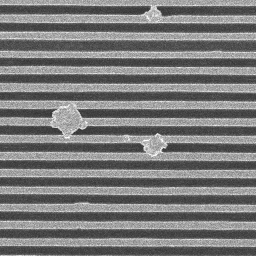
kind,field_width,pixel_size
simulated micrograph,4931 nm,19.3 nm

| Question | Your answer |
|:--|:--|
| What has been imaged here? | parallel lines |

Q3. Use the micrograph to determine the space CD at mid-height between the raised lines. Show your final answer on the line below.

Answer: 149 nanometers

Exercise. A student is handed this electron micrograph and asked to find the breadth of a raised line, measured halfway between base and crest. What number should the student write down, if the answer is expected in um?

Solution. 0.169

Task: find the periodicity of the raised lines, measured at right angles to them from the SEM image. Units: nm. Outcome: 331